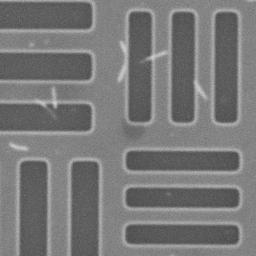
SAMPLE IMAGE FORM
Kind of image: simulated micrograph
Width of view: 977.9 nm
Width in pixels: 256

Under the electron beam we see groups of lines, slits or small figures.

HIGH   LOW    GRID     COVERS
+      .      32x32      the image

...........+++++++++++++++++++++
............+++++..+++..++++.+++
............++++...++...+++...++
...........+++++...++...+++...++
++++++++++++++++...++...+++...++
++++++++++++++++...++...+++...++
...........+++++...++...+++...++
............++++...++...+++...++
............++++...++...+++...++
...........+++++...++...+++...++
++++++++++++++++...++...+++...++
++++++++++++++++...++...+++...++
++++++++++++++++...++...+++...++
...........+++++...++...+++...++
............++++...++...+++...++
............++++++++++++++++.+++
...........+++++++++++++++++++++
++++++++++++++++++++++++++++++++
++++++++++++++++++++++++++++++++
++++++++++++++++..............++
+++...+++...++++..............++
++....+++...++++++++++++++++++++
++....+++...++++++++++++++++++++
++....+++...++++.............+++
++....+++...++++..............++
++....+++...++++..............++
++....+++...++++++++++++++++++++
++....+++...++++++++++++++++++++
++....+++...++++..............++
++....+++...++++..............++
++....+++...++++.............+++
++....+++...++++++++++++++++++++